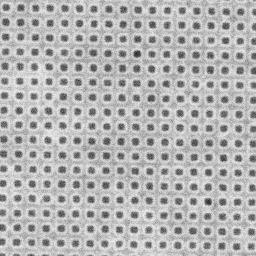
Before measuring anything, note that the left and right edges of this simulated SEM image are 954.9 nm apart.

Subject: a regular array of holes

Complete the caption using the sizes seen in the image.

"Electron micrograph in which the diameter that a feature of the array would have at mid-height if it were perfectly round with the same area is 33.1 nm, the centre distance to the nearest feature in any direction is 0.0535 microns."